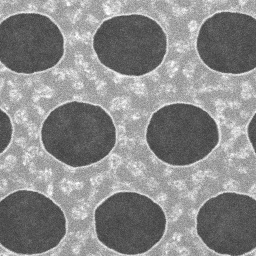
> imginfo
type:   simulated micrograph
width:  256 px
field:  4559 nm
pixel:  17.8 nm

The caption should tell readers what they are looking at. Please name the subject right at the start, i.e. holes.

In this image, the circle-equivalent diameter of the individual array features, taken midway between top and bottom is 1200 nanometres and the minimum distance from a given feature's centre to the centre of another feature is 1830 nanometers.